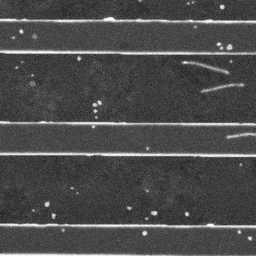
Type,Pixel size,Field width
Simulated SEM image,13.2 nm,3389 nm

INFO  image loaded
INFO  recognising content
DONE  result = lines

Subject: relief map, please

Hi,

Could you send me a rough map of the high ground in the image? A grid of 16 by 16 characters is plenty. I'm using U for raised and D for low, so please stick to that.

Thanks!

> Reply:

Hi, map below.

DDDDDDDDDDDDDDDD
UUUUUUUUUUUUUUUU
UUUUUUUUUUUUUUUU
DDDDDDDDDDDDDDDD
DDDDDDDDDDDDDDDD
DDDDDDDDDDDDDDDD
DDDDDDDDDDDDDDDD
DDDDDDDDDDDDDDDD
UUUUUUUUUUUUUUUU
UUUUUUUUUUUUUUUU
DDDDDDDDDDDDDDDD
DDDDDDDDDDDDDDDD
DDDDDDDDDDDDDDDD
DDDDDDDDDDDDDDDD
UUUUUUUUUUUUUUUU
UUUUUUUUUUUUUUUU